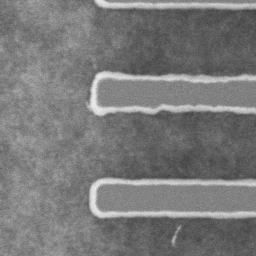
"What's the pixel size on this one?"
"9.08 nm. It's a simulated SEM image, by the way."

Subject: one or a few lines or trenches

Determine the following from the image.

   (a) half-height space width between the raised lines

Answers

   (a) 640 nanometers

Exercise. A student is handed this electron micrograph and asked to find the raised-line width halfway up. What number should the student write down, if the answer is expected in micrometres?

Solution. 0.312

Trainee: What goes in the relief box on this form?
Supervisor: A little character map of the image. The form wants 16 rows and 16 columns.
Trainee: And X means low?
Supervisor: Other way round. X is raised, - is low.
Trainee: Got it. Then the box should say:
----------------
----------------
----------------
----------------
----------------
------XXXXXXXXXX
------XXXXXXXXXX
----------------
----------------
----------------
----------------
------XXXXXXXXXX
------XXXXXXXXXX
-------------XX-
----------------
----------------